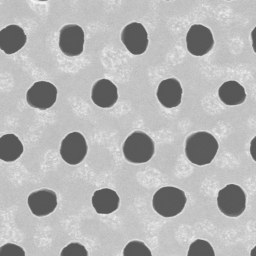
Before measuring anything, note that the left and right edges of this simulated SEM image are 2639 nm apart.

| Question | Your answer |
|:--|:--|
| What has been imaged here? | a regular array of holes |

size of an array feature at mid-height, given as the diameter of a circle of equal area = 294 nm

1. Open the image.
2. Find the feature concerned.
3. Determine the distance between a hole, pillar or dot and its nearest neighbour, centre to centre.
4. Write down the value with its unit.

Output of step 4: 635 nm